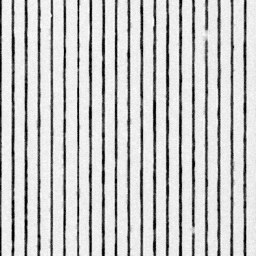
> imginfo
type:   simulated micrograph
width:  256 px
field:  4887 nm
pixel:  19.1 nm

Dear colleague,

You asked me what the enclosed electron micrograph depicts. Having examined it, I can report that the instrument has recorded parallel lines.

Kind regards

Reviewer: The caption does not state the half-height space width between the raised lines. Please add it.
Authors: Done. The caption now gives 0.0668 um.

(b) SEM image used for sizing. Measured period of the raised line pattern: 0.246 um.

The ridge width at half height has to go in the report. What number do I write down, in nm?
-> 181